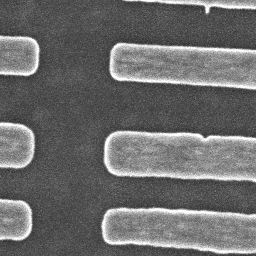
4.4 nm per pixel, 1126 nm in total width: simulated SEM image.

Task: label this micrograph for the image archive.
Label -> one or a few lines or trenches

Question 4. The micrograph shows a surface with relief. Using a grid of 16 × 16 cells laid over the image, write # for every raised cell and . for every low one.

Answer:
...............#
................
##..............
##.....#########
##.....#########
................
................
................
##.....#####....
##.....#########
.......#########
................
................
##.....#########
##....##########
............####